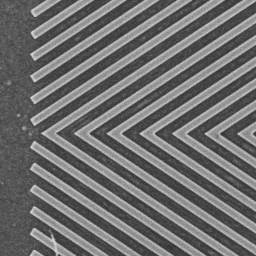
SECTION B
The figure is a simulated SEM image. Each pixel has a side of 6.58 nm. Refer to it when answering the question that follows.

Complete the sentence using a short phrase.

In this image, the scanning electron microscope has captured groups of lines, slits or small figures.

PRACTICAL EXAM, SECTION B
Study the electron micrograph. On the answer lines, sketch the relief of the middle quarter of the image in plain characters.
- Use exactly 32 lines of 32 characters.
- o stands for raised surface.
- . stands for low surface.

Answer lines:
...oooo.....ooo.....ooo.....ooo.
..ooo.....ooo.....oooo....oooo..
oooo.....ooo.....ooo.....ooo....
oo.....oooo....oooo....oooo.....
o.....ooo.....ooo.....ooo.....oo
....oooo....oooo....oooo.....ooo
...ooo.....ooo.....ooo.....oooo.
.oooo....oooo....oooo.....ooo...
ooo.....ooo.....ooo.....oooo....
oo....oooo....oooo.....ooo.....o
.....ooo.....ooo.....oooo....ooo
...oooo....oooo.....ooo.....ooo.
..ooo.....ooo.....oooo....oooo..
oooo....oooo....oooo.....ooo....
oo.....oooo....oooo....oooo....o
o....oooo....oooo.....ooo.....oo
....ooo.....oooo....oooo....oooo
...ooo.....ooo.....oooo....oooo.
....oooo....oooo....oooo.....ooo
o.....ooo.....ooo.....ooo.....oo
ooo....oooo....oooo....oooo....o
oooo.....ooo.....ooo.....ooo....
..oooo....ooo.....oooo....oooo..
...oooo.....ooo.....ooo.....ooo.
.....oooo....ooo.....oooo....ooo
oo....oooo....oooo.....ooo.....o
ooo.....oooo....ooo.....oooo....
.oooo....oooo....oooo.....ooo...
...ooo.....ooo.....ooo.....oooo.
....oooo....oooo....oooo.....ooo
oo....oooo....oooo....oooo....oo
ooo.....ooo.....ooo.....ooo.....